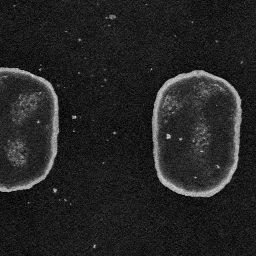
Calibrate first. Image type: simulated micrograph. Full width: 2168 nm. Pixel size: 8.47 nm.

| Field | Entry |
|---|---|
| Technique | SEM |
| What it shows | raised bodies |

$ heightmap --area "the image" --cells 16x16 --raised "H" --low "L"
LLLLLLLLLLLLLLLL
LLLLLLLLLLLLLLLL
LLLLLLLLLLLLLLLL
LLLLLLLLLLLLLLLL
HHLLLLLLLLLLLLLL
HHHLLLLLLLHHHHHL
HHHHLLLLLLHHHHHL
HHHHLLLLLLHHHHHL
HHHLLLLLLLHHHHHL
HHHLLLLLLLHHHHHL
HHHLLLLLLLHHHHHL
HHLLLLLLLLHHHHLL
LLLLLLLLLLLLLLLL
LLLLLLLLLLLLLLLL
LLLLLLLLLLLLLLLL
LLLLLLLLLLLLLLLL